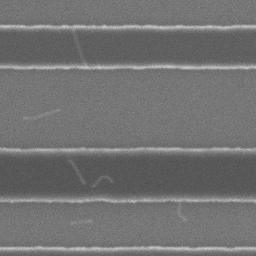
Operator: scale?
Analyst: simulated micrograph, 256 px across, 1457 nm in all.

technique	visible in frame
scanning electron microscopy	lines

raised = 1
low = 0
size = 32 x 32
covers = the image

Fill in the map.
00000000000000000000000000000000
00000000000000000000000000000000
00000000000000000000000000000000
11111111111111111111111111111111
11111111111111111111111111111111
11111111111111111111111111111111
11111111111111111111111111111111
11111111111111111111111111111111
01111111101111101110000111111111
00000000000000000000000000000000
00000000000000000000000000000000
00000000000000000000000000000000
00000000000000000000000000000000
00000000000000000000000000000000
00000000000000000000000000000000
00000000000000000000000000000000
00000000000000000000000000000000
00000000000000000000000000000000
00000000000000000000000000000000
11111111111111111111111111111111
11111111111111111111111111111111
11111111111111111111111111111111
11111111111111111111111111111111
11111111111111111111111111111111
11111111111111111111111111111111
00000000000000000000000000000000
00000000000000000000000000000000
00000000000000000000000000000000
00000000000000000000000000000000
00000000000000000000000000000000
00000000000000000000000000000000
11111111111111111111111111111111